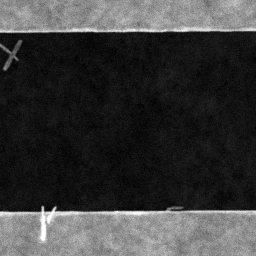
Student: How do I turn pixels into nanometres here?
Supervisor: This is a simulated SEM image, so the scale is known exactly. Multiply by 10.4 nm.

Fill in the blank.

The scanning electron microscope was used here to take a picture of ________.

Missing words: wiring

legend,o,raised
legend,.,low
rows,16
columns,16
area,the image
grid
oooo..oooooooooo
oooo..oooooooooo
................
................
................
................
................
................
................
................
................
................
................
ooo..oo..ooooooo
oooo.....ooooooo
oooo..oooooooooo